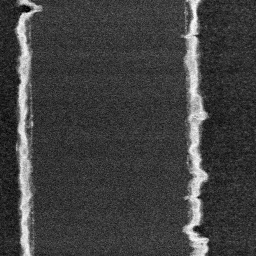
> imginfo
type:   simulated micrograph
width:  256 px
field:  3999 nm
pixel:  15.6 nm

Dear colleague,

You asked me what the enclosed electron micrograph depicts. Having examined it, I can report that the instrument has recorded one or a few lines or trenches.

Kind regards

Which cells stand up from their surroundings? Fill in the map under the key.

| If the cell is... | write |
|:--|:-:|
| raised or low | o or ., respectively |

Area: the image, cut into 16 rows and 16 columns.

..oooooooooo....
.ooooooooooo....
.ooooooooooo....
..oooooooooo....
.ooooooooooo....
.ooooooooooo....
.ooooooooooo....
.ooooooooooo....
.ooooooooooo....
.ooooooooooo....
.ooooooooooo....
.ooooooooooo....
..oooooooooo....
..oooooooooo....
..oooooooooo....
..ooooooooooo...